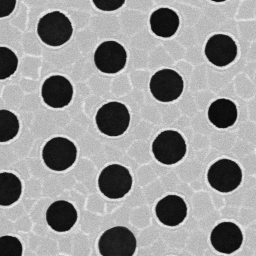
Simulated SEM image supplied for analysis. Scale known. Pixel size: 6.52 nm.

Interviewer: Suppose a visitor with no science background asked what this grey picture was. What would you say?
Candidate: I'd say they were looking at a regular array of holes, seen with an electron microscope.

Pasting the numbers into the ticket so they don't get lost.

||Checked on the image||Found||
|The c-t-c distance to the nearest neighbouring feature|405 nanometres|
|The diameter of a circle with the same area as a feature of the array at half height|32.4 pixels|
